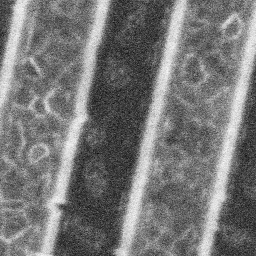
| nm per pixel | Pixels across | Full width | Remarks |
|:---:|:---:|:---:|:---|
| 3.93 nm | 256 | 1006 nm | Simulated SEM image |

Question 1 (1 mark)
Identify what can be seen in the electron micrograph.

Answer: one or a few lines or trenches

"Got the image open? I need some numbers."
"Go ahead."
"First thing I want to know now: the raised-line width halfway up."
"318 nm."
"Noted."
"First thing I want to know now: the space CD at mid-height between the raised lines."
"287 nanometres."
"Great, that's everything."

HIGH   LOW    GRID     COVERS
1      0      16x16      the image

0111110000011111
0111110000011111
0111110000011111
0111110000111111
1111110000111110
1111100000111110
1111100000111110
1111100000111110
1111100001111110
1111000001111100
1111000001111100
1111000001111100
1111000011111100
1110000011111000
1110000011111000
1110000011111000